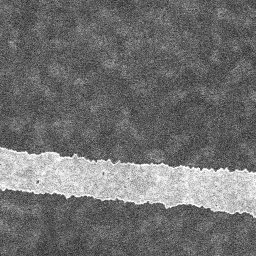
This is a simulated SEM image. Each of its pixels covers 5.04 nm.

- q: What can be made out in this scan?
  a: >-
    one or a few lines or trenches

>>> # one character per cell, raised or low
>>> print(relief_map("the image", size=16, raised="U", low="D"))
DDDDDDDDDDDDDDDD
DDDDDDDDDDDDDDDD
DDDDDDDDDDDDDDDD
DDDDDDDDDDDDDDDD
DDDDDDDDDDDDDDDD
DDDDDDDDDDDDDDDD
DDDDDDDDDDDDDDDD
DDDDDDDDDDDDDDDD
DDDDDDDDDDDDDDDD
UDDDDDDDDDDDDDDD
UUUUUUUUUUUUDDDD
UUUUUUUUUUUUUUUU
DDDDDDDDUUUUUUUU
DDDDDDDDDDDDDDDD
DDDDDDDDDDDDDDDD
DDDDDDDDDDDDDDDD